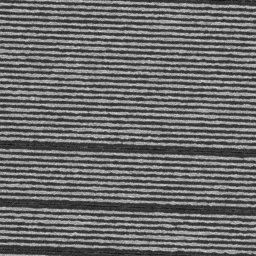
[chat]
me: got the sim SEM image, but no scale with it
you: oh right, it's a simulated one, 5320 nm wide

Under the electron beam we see parallel lines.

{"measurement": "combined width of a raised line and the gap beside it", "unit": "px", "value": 5.83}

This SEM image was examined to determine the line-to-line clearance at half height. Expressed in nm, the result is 80.5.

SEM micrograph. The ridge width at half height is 41.5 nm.